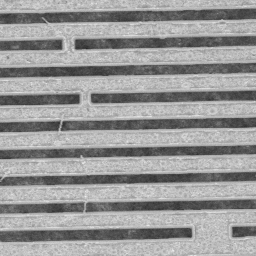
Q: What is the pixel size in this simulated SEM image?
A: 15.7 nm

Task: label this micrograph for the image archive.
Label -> parallel lines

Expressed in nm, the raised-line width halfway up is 231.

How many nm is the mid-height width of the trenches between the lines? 190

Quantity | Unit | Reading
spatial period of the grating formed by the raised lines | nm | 426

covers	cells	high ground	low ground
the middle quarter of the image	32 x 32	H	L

LLLLLLLLLLLLLLLLLLLLLLLLLLLLLLLL
LLLLLLLLLLLLLLLLLLLLLLLLLLLLLLLL
LLLLLLLLLLLLLLLLLLLLLLLLLLLLLLLL
LLLLLLHHHHHHHHHHHHHHHHHHHHHHHHHH
HHHHHHHHHHHHHHHHHHHHHHHHHHHHHHHH
HHHHHHHHHHHHHHHHHHHHHHHHHHHHHHHH
HHHHHHHHHHHHHHHHHHHHHHHHHHHHHLLL
LLLLHHLLLLLLLLLLLLLLLLLLLLLLLLLL
LLLLHHLLLLLLLLLLLLLLLLLLLLLLLLLL
LLLLHHHLLLLLLLLLLLLLLLLLLLLLLLLL
LLHHHHHHHHHHHHHHHHHHHHHHHHHHHHHH
HHHHHHHHHHHHHHHHHHHHHHHHHHHHHHHH
HHHHHHHHHHHHHHHHHHHHHHHHHHHHHHHH
HHHHHHHHHHHHHHLLLLLLLLLLLLLLLLLL
LLLLLLLLLLLLLLLLLLLLLLLLLLLLLLLL
LLLLLLLLLLLLLLLLLLLLLLLLLLLLLLLL
LLLLLLLLLLLLLLLLLLLLLLLLLLLLLLLL
HHHHHHHHHHHHHHHHHHHHHHHHHHHHHHHH
HHHHHHHHHHHHHHHHHHHHHHHHHHHHHHHH
HHHHHHHHHHHHHHHHHHHHHHHHHHHHHHHH
HLLLLHHHHHHLLLLLLLLLLLLLLLLLLLLL
LLLLLLLLLLLLLLLLLLLLLLLLLLLLLLLL
LLLLLLLLLLLLLLLLLLLLLLLLLLLLLLLL
LLLLHLLLLLLLHHHHHLLLLLLHHHHHHHHH
HHHHHHHHHHHHHHHHHHHHHHHHHHHHHHHH
HHHHHHHHHHHHHHHHHHHHHHHHHHHHHHHH
HHHHHHHHHHHHHHHHHHHHHHHHHHHHHHHH
HHHHHHHLLLLLLLLLLLLLLLLLLLLLLLLL
LLLLLLLLLLLLLLLLLLLLLLLLLLLLLLLL
LLLLLLLLLLLLLLLLLLLLLLLLLLLLLLLL
LLLLLLLLHHHHHHHHHHHHHHHHHHHHHHHH
HHHHHHHHHHHHHHHHHHHHHHHHHHHHHHHH